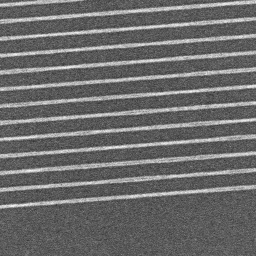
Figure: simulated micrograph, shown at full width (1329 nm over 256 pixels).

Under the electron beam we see parallel lines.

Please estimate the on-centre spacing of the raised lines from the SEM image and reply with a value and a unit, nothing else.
87 nm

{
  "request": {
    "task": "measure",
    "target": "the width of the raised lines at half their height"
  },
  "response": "0.0116 microns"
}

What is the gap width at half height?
14.5 pixels